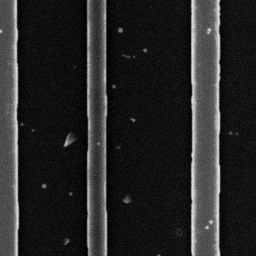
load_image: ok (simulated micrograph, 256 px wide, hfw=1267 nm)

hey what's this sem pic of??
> lines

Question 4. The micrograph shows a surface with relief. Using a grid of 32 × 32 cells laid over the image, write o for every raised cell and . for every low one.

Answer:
oo.........oo...........ooo.....
oo.........oo...........ooo.....
oo.........oo...........ooo.....
oo.........oo...........ooo.....
oo.........oo...........ooo.....
oo.........oo...........ooo.....
oo.........oo...........ooo.....
oo.........oo...........ooo.....
oo.........oo...........ooo.....
oo.........oo...........ooo.....
oo.........oo...........ooo.....
oo.........oo...........ooo.....
oo.........oo...........ooo.....
oo.........oo...........ooo.....
oo.........oo...........ooo.....
oo.........oo...........ooo.....
oo.........oo...........ooo.....
oo.........oo...........ooo.....
oo.........oo...........ooo.....
oo.........oo...........ooo.....
oo.........oo...........ooo.....
oo.........oo...........ooo.....
oo.........oo...........ooo.....
oo.........oo...........ooo.....
oo.........oo...........ooo.....
oo.........oo...........ooo.....
oo.........oo...........ooo.....
oo.........oo...........ooo.....
oo.........oo...........ooo.....
oo.........oo...........ooo.....
oo.........oo...........ooo.....
oo.........oo...........ooo.....